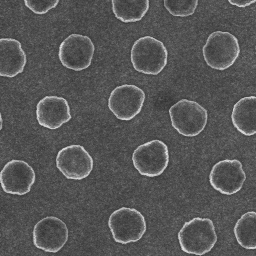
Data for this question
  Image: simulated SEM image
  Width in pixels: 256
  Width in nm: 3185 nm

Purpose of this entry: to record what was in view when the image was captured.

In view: a regular array of raised bodies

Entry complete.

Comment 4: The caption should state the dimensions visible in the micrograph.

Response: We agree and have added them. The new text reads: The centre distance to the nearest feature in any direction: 743 nm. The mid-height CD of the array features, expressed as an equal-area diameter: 0.442 microns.